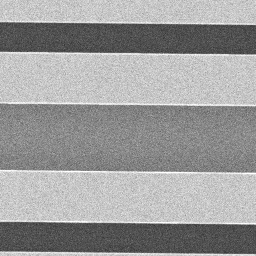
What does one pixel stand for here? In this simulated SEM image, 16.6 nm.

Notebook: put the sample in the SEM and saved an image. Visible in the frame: groups of lines, slits or small figures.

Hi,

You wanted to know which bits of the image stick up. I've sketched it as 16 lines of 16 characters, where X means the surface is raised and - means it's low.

XXXXXXXXXXXXXXXX
-------------XXX
----------------
XXXXXXXXXXXXXXXX
XXXXXXXXXXXXXXXX
XXXXXXXXXXXXXXXX
-----XXXXXXXXXXX
----------------
----------------
----------------
----------------
XXXXXXXXXXXXXXXX
XXXXXXXXXXXXXXXX
XXXXXXXXXXXXXXXX
----------------
----------------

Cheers